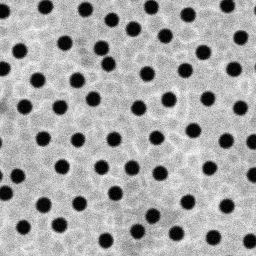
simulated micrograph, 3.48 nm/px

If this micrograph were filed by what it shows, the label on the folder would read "a regular array of holes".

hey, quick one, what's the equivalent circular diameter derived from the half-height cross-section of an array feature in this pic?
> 49.8 nanometres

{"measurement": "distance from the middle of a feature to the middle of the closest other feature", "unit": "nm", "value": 107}